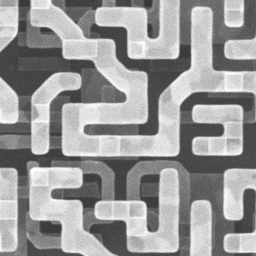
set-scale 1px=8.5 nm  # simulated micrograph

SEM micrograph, wiring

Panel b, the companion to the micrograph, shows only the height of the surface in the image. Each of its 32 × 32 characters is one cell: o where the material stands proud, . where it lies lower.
oo..ooo.............oo......oo..
oo..oooo....oooooo..oo..oo..oo..
oo..ooooo...oooooo..oo..oo..oo..
oo....oooo......oo..oo..oo......
oo.....oooo.....ooo.oo..oo......
o.......oooooo..oooooo..oo..oooo
........oooooo..oooooo..oo..oooo
...........oooo.........oo......
............oooo........ooo.....
......oooo...ooooo....oooooooooo
o....ooooo....oooo...ooooooooooo
oo..oooo.......ooo..ooooo......o
oo..ooo.........oo..ooo.........
oo..oo..oooooooooo..ooo.oooooo..
oo..oo..oooooooooo..oo..oooooo..
....oo..ooo.........oo......oo..
....oo..ooo.........oo......oo..
....oo..oooooooooooooo..oooooo..
....oo..oooooooooooooo..oooooo..
................................
................................
oo..oooooo..........oo......oooo
oo..oooooo..........oo......oooo
oo..oooooo..........oo......oooo
oo..oo..............oo......oo..
oo..oooooo..oooooo..oo..oo..oo..
oo..oooooo..oooooo..oo..oo..oo..
oo.....ooo.....ooo..oo..oo......
oo......oo......oo..oo..oo......
oo......oooo....oooooo..oo..oooo
oo......ooooo...oooooo..oo..oooo
........oooooo..........oo...oo.